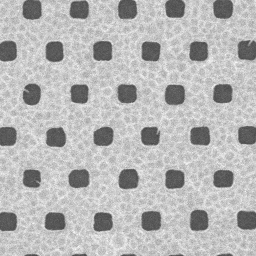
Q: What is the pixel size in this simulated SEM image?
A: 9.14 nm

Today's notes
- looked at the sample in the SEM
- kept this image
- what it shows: a regular array of holes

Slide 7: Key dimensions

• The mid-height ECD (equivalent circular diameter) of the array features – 193 nm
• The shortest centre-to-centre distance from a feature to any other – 435 nm